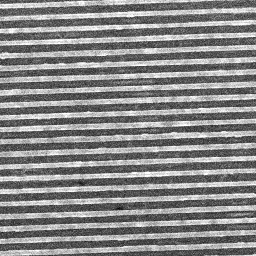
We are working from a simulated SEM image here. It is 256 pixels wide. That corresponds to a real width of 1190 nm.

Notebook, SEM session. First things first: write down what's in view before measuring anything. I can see parallel lines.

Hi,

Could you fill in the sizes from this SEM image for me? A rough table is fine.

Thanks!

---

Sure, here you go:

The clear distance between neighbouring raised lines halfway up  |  35.5 nanometers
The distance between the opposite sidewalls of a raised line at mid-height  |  22.1 nanometers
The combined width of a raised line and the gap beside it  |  0.0575 µm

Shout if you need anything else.